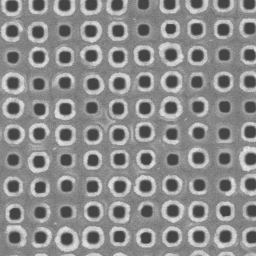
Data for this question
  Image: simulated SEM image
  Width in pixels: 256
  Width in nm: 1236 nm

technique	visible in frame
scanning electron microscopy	a regular array of holes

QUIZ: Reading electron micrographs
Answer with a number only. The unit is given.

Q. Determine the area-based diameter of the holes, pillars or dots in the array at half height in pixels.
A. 12.4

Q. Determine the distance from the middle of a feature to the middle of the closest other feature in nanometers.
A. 122